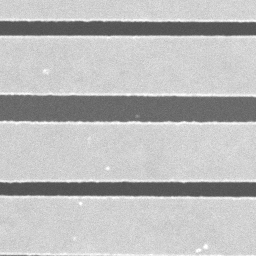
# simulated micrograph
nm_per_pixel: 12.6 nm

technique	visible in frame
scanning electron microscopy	lines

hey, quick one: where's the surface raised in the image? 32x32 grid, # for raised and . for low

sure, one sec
################################
################################
################################
................................
................................
################################
################################
################################
################################
################################
################################
################################
................................
................................
................................
################################
################################
################################
################################
################################
################################
################################
################################
................................
#..#...#........................
################################
################################
################################
################################
################################
################################
################################